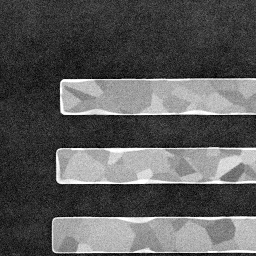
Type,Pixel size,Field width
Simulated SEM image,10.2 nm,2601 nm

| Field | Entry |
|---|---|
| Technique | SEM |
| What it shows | groups of lines, slits or small figures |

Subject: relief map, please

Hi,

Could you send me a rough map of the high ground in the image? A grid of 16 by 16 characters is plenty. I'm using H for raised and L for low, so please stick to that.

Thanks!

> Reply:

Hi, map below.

LLLLLLLLLLLLLLLL
LLLLLLLLLLLLLLLL
LLLLLLLLLLLLLLLL
LLLLLLLLLLLLLLLL
LLLLLLLLLLLLLLLL
LLLLHHHHHHHHHHHH
LLLLHHHHHHHHHHHH
LLLLLLLLLLLLLLLL
LLLLLLLLLLLLLLLL
LLLLHHHHHHHHHHHH
LLLLHHHHHHHHHHHH
LLLLLLLLLLLLLLLL
LLLLLLLLLLLLLLLL
LLLLLLLLLLLLLLLL
LLLHHHHHHHHHHHHH
LLLHHHHHHHHHHHHH